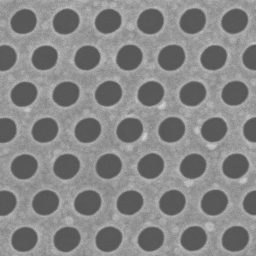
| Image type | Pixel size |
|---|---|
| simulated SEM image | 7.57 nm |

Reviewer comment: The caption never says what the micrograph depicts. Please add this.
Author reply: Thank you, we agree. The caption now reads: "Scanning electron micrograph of a regular array of holes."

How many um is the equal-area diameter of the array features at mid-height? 0.196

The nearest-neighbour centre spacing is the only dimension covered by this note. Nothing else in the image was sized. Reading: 316 nm